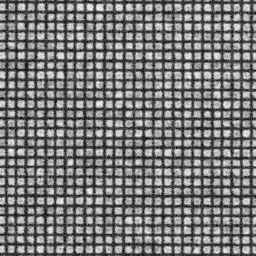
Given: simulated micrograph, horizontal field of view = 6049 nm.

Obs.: a regular array of raised bodies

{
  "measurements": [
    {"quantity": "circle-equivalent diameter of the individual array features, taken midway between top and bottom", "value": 146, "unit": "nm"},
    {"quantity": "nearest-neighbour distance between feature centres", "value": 0.219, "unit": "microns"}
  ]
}